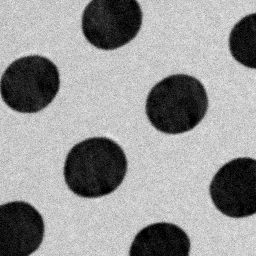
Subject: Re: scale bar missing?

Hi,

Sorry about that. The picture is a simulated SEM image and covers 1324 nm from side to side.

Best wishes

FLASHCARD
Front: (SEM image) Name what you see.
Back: holes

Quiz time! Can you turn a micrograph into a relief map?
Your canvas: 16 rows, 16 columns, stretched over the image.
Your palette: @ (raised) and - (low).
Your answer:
@@@@@----@@@@@@@
@@@@@----@@@@@@-
@@@@@@--@@@@@@--
@@@@@@@@@@@@@@@-
----@@@@@@@@@@@@
----@@@@@@---@@@
---@@@@@@----@@@
@@@@@@@@@----@@@
@@@@@@@@@@@@@@@@
@@@@----@@@@@@@@
@@@@----@@@@@@--
@@@@---@@@@@@---
@@@@@@@@@@@@@---
---@@@@@@@@@@@--
---@@@@@@--@@@@@
--@@@@@@----@@@@